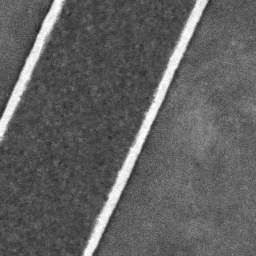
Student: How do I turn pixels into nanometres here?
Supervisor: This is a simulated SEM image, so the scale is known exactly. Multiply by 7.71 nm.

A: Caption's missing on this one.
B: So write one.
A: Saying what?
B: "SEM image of one or a few lines or trenches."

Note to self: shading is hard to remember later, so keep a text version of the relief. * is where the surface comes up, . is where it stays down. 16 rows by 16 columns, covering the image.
....********....
...*********....
...*********....
..*********.....
..*********.....
.*********......
.*********......
*********.......
*********.......
********........
********........
*******.........
*******.........
*******.........
******..........
******..........